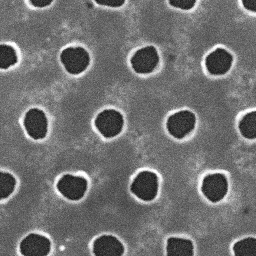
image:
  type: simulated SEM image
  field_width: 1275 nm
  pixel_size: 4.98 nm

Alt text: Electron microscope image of a regular array of holes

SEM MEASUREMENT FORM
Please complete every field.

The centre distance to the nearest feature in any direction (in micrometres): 0.352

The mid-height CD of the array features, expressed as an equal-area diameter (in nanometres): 143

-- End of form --